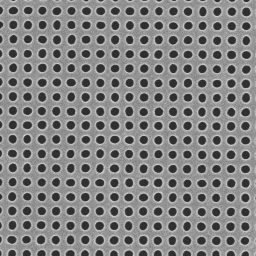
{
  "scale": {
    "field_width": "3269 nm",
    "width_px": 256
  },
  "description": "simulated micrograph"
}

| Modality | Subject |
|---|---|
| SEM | a regular array of holes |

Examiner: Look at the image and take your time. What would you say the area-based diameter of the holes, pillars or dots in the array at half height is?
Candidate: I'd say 107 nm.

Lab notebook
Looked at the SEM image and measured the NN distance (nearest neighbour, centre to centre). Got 180 nm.